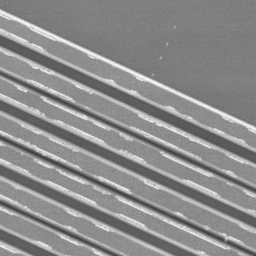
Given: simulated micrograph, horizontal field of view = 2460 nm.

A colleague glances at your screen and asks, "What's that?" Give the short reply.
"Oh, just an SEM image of parallel lines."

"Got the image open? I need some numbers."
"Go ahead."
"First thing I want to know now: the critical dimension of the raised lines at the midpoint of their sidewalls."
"192 nm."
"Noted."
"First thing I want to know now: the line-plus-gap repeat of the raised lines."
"287 nm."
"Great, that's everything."